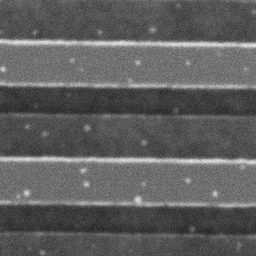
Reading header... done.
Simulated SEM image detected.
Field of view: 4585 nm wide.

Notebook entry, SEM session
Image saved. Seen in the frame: lines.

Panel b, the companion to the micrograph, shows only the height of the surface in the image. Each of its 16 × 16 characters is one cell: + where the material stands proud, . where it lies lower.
................
................
................
++++++++++++++++
++++++++++++++++
................
................
................
................
................
++++++++++++++++
++++++++++++++++
++++++++++++++++
................
................
................